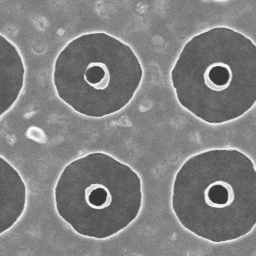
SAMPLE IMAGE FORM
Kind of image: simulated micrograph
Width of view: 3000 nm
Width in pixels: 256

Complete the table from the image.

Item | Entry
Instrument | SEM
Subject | ring-shaped grooves with a dot in the middle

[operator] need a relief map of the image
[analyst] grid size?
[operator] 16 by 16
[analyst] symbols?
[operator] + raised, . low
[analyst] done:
++++++++++++++++
++++++++++++++++
+++++..+++++....
.+++....+++.....
.++......++.....
.++......++.....
.+++....+++.....
+++++++++++++.++
++++++++++++++++
+++++++++++++..+
.+++....+++.....
.+++.....++.....
..+......++.....
.+++....+++.....
+++++..+++++...+
++++++++++++++++